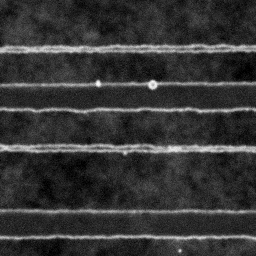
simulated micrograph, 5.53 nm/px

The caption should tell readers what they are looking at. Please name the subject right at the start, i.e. lines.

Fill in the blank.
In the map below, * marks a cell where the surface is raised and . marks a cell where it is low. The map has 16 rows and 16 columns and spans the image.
................
................
................
................
................
****************
****************
................
................
................
................
................
................
****************
****************
................